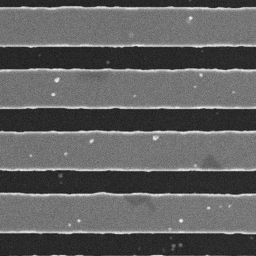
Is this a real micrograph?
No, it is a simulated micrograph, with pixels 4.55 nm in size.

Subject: lines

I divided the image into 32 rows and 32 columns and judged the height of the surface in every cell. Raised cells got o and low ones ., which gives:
................................
oooooooooooooooooooooooooooooooo
oooooooooooooooooooooooooooooooo
oooooooooooooooooooooooooooooooo
oooooooooooooooooooooooooooooooo
oooooooooooooooooooooooooooooooo
................................
................................
................................
oooooooooooooooooooooooooooooooo
oooooooooooooooooooooooooooooooo
oooooooooooooooooooooooooooooooo
oooooooooooooooooooooooooooooooo
ooooo...oooooooooooooooooooooooo
................................
................................
o.....o..oooooo..o.ooo.ooooooooo
oooooooooooooooooooooooooooooooo
oooooooooooooooooooooooooooooooo
oooooooooooooooooooooooooooooooo
oooooooooooooooooooooooooooooooo
................................
................................
................................
oooooooooooooooooooooooooooooooo
oooooooooooooooooooooooooooooooo
oooooooooooooooooooooooooooooooo
oooooooooooooooooooooooooooooooo
oooooooooooooooooooooooooooooooo
................................
................................
................................